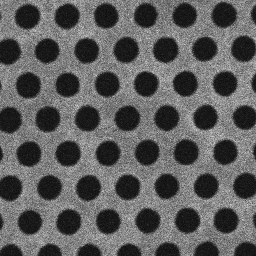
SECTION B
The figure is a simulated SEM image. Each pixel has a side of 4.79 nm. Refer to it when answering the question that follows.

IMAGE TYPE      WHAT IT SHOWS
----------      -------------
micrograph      a regular array of holes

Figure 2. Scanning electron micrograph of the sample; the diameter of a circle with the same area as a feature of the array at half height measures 123 nm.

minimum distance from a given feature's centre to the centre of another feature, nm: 187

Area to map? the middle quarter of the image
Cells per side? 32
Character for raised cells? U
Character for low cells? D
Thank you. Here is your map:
UUUUUUUUUUUUUUUUUUUUUUUUUUUUUUUU
UUUUUUUUUUUUUUUUUUUUUUUUUUUUUUUU
DDDUUUUUUDDDDUUUUUDDDDDUUUUUDDDD
DDDUUUUUDDDDDUUUUUDDDDDUUUUDDDDD
DDDDUUUUDDDDDDUUUDDDDDDDUUUDDDDD
DDDDUUUUDDDDDDUUUDDDDDDDUUUDDDDD
DDDDUUUUDDDDDDUUUUDDDDDUUUUUDDDD
DDDUUUUUDDDDDUUUUUUDDDDUUUUUDDDD
DUUUUUUUUUUUUUUUUUUUUUUUUUUUUUUU
UUUUUUUUUUUUUUUUUUUUUUUUUUUUUUUU
UUUUUDDUUUUUUUUUDUUUUUUUDDDUUUUU
UUUDDDDDUUUUUUDDDDUUUUUDDDDDUUUU
UUUDDDDDDUUUUDDDDDDUUUUDDDDDDUUU
UUUDDDDDDUUUUDDDDDDUUUDDDDDDDUUU
UUUDDDDDDUUUUDDDDDDUUUDDDDDDDUUU
UUUDDDDDDUUUUDDDDDDUUUUDDDDDUUUU
UUUUDDDDUUUUUUDDDUUUUUUUDDDUUUUU
UUUUUUUUUUUUUUUUUUUUUUUUUUUUUUUU
UUUUUUUUUUUUUUUUUUUUUUUUUUUUUUUU
DDDUUUUUUUDDDUUUUUUDDDDUUUUUUDDD
DDDDUUUUDDDDDDUUUUDDDDDDUUUUDDDD
DDDDUUUUDDDDDDUUUUDDDDDDUUUUDDDD
DDDDUUUUDDDDDDUUUUDDDDDDUUUDDDDD
DDDDUUUUDDDDDDUUUUDDDDDDUUUUDDDD
DDDDUUUUDDDDDUUUUUUDDDDUUUUUDDDD
DDDUUUUUUUDDUUUUUUUUDUUUUUUUUUUU
UUUUUUUUUUUUUUUUUUUUUUUUUUUUUUUU
UUUUUUUUUUUUUUUUUUUUUUUUUDUUUUUU
UUUUDDDDUUUUUUDDDDUUUUUUDDDDUUUU
UUUDDDDDDUUUUDDDDDDUUUUDDDDDDUUU
UUUDDDDDDUUUUDDDDDDUUUUDDDDDDUUU
UUUDDDDDDUUUUDDDDDDUUUUDDDDDDUUU